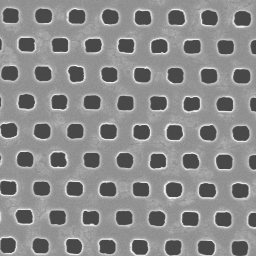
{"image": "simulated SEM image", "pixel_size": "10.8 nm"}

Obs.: a regular array of holes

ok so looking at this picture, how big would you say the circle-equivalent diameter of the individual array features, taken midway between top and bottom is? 178 nanometers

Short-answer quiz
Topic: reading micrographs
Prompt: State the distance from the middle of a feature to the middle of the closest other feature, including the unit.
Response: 354 nm